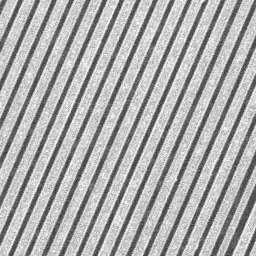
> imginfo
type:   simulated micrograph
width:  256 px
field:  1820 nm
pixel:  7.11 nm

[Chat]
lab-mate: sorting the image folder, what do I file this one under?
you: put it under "parallel lines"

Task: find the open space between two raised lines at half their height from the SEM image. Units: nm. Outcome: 47.3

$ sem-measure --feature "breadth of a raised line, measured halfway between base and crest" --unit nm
64.4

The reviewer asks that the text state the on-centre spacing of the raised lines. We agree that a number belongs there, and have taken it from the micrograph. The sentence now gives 110 nanometres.